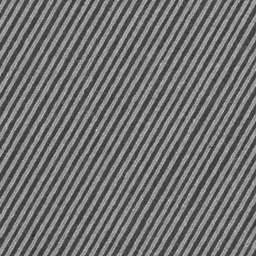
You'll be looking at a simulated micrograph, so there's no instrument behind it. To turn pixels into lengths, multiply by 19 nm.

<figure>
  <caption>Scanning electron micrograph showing parallel lines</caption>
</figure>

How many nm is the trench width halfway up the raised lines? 92.5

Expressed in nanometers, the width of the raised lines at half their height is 65.8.